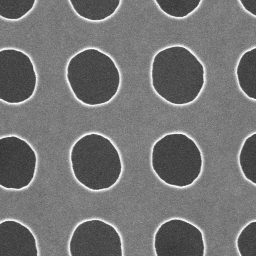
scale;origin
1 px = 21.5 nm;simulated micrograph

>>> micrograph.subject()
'holes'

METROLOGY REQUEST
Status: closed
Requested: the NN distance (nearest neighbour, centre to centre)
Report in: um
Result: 1.77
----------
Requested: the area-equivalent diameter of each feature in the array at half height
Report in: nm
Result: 1140